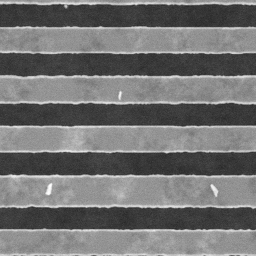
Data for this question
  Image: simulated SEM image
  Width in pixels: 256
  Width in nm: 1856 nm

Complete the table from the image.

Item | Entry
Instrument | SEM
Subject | lines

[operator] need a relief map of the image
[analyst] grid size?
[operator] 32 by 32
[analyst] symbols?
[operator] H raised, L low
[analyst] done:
LLLLHHHLHHLHLHHHHHLLHHHHHLLHHLHH
LLLLLLLLLLLLLLLLLLLLLLLLLLLLLLLL
LLLLLLLLLLLLLLLLLLLLLLLLLLLLLLLL
HHHHHHHHHHHHHHHHHHHHHHHHHHHHHHHH
HHHHHHHHHHHHHHHHHHHHHHHHHHHHHHHH
HHHHHHHHHHHHHHHHHHHHHHHHHHHHHHHH
HHHHHHHHHHHHHHHHHHHHHHHHHHHHHHHH
LLLLLLLLLLLLLLLLLLLLLLLLLLLLLLLL
LLLLLLLLLLLLLLLLLLLLLLLLLLLLLLLL
HHLLHHLHLHHHHHHHHHLLLHHLHHHLLLHH
HHHHHHHHHHHHHHHHHHHHHHHHHHHHHHHH
HHHHHHHHHHHHHHHHHHHHHHHHHHHHHHHH
HHHHHHHHHHHHHHHHHHHHHHHHHHHHHHHH
LLLLLLLLLLLLLLLLLLLLLLLLLLLLLLLL
LLLLLLLLLLLLLLLLLLLLLLLLLLLLLLLL
LLLLLLLLLLLLLLLLLLLLLLLLLLLLLLLL
HHHHHHHHHHHHHHHHHHHHHHHHHHHHHHHH
HHHHHHHHHHHHHHHHHHHHHHHHHHHHHHHH
HHHHHHHHHHHHHHHHHHHHHHHHHHHHHHHH
LLLLLLLLLLLLLLLLLLLLLLLLLLLLLLLL
LLLLLLLLLLLLLLLLLLLLLLLLLLLLLLLL
LLLLLLLLLLLLLLLLLLLLLLLLLLLLLLLL
HHHHHHHHHHHHHHHHHHHHHHHHHHHHHHHH
HHHHHHHHHHHHHHHHHHHHHHHHHHHHHHHH
HHHHHHHHHHHHHHHHHHHHHHHHHHHHHHHH
HHHHHHHHHHHHHHHHHHHHHHHHHHHHHHHH
LLLLLLLLLLLLLLLLLLLLLLLLLLLLLLLL
LLLLLLLLLLLLLLLLLLLLLLLLLLLLLLLL
LLLLLLLLLLLLLLLLLLLLLLLLLLLLLLLL
HHHHHHHHHHHHHHHHHHHHHHHHHHHHHHHH
HHHHHHHHHHHHHHHHHHHHHHHHHHHHHHHH
HHHHHHHHHHHHHHHHHHHHHHHHHHHHHHHH